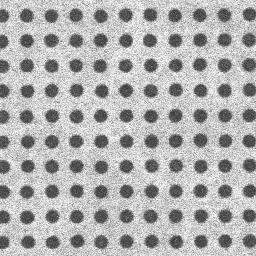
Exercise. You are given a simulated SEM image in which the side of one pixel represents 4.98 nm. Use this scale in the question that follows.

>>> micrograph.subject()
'a regular array of holes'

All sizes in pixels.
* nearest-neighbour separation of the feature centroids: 24.4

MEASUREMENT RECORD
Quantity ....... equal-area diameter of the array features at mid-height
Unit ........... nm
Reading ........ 67.5